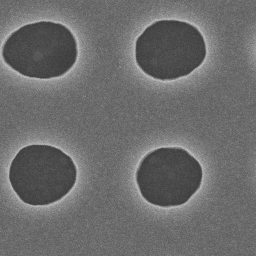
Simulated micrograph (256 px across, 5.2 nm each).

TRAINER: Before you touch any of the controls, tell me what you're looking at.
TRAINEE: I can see holes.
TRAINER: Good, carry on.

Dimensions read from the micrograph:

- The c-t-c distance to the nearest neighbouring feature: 653 nanometres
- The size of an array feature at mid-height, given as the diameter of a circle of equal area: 0.335 microns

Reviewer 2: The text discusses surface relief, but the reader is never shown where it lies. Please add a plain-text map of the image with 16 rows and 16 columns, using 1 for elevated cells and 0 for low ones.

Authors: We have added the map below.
1111111111111111
1100111111001111
0000011110000111
0000011100000111
1000111110001111
1111111111111111
1111111111111111
1111111111111111
1111111111111111
1000111111001111
1000011110000111
1000011110000111
1000111110001111
1111111111111111
1111111111111111
1111111111111111